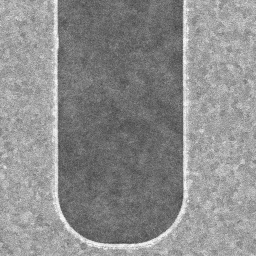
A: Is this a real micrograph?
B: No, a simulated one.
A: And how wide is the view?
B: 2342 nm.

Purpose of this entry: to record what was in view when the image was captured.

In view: one or a few lines or trenches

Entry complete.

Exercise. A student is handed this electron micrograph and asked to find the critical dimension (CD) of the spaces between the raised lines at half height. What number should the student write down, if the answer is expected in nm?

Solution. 1180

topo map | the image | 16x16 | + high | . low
+++.........++++
+++.........++++
++++........++++
+++.........++++
+++.........++++
+++.........++++
+++.........++++
+++.........++++
+++.........++++
+++.........++++
+++.........++++
+++.........++++
++++........++++
++++.......+++++
+++++.....++++++
++++++++++++++++